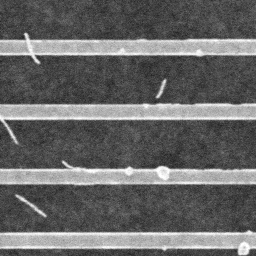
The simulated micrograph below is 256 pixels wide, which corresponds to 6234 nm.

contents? lines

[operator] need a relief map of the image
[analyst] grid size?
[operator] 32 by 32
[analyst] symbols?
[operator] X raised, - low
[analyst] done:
--------------------------------
--------------------------------
--------------------------------
--------------------------------
--------------------------------
XXXXXXXXXXXXXXXXXXXXXXXXXXXXXXXX
XXXXXXXXXXXXXXXXXXXXXXXXXXXXXXXX
--------------------------------
--------------------------------
--------------------------------
--------------------------------
--------------------------------
--------------------------------
XXXXXXXXXXXXXXXXXXXXXXXXXXXXXXXX
XXXXXXXXXXXXXXXXXXXXXXXXXXXXXXXX
--------------------------------
--------------------------------
--------------------------------
--------------------------------
--------------------------------
--------------------------------
XXXXXXXXXXXXXXXXXXXXXXXXXXXXXXXX
XXXXXXXXXXXXXXXXXXXXXXXXXXXXXXXX
--------------------------------
--------------------------------
--------------------------------
--------------------------------
--------------------------------
--------------------------------
XXXXXXXXXXXXXXXXXXXXXXXXXXXXXXXX
XXXXXXXXXXXXXXXXXXXXXXXXXXXXXXXX
------------------------------X-